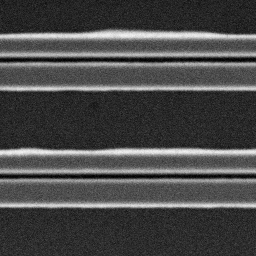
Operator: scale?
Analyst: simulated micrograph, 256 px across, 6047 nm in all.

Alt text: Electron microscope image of lines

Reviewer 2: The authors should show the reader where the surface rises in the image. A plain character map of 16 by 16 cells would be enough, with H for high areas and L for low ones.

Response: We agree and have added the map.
LLLLLLLLLLLLLLLL
LLLLLLLLLLLLLLLL
HHHHHHHHHHHHHHHH
HHHHHHHHHHHHHHHH
HHHHHHHHHHHHHHHH
HHHHHHHHHHHHHHHH
LLLLLLLLLLLLLLLL
LLLLLLLLLLLLLLLL
LLLLLLLLLLLLLLLL
LLLLLLLLLLLLLLLL
HHHHHHHHHHHHHHHH
HHHHHHHHHHHHHHHH
HHHHHHHHHHHHHHHH
LLLLLLLLLLLLLLLL
LLLLLLLLLLLLLLLL
LLLLLLLLLLLLLLLL